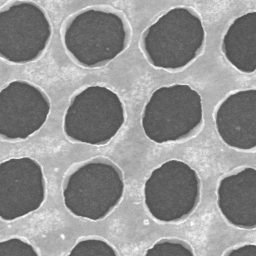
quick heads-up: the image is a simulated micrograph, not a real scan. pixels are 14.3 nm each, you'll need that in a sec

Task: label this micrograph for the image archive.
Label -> holes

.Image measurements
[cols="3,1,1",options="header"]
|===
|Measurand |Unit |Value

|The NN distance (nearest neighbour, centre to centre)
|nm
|1060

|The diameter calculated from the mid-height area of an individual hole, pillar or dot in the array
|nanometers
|844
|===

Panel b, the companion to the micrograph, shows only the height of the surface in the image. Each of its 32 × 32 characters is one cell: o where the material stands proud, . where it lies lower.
oo...ooooooooooooooooooooooooooo
.....ooooo...oooooooo...oooooooo
......ooo......ooooo.....oooo...
......oo........oo.......oooo...
......oo........oo........oo....
......oo........oo.......ooo....
.....oooo......ooo.......ooo....
o...oooooo....ooooo.....oooo....
ooooooooooooooooooooo.oooooooo..
oooooooooooooooooooooooooooooooo
o...oooooooooooooooooooooooooooo
.....ooooo....ooooo......ooooo..
......ooo......oooo......ooo....
......ooo......ooo.......oo.....
......oo.......ooo.......oo.....
.....ooo.......ooo.......oo.....
....oooo.......ooo......ooo.....
oooooooooo....ooooo...oooooo....
oooooooooooooooooooooooooooooo.o
oooooooooooooooooooooooooooooooo
.....oooooo...oooooo...ooooooooo
.....oooo......oooo.....oooooo..
......oo.......ooo.......ooo....
......oo.......ooo.......oo.....
......oo.......ooo.......oo.....
.....ooo.......ooo.......oo.....
....ooooo.....ooooo.....oooo....
ooooooooooo.oooooooo..ooooooo...
oooooooooooooooooooooooooooooo..
oooooooooooooooooooooooooooooooo
...ooooooo...oooooo....ooooooooo
....ooooo.....oooo......ooooo...